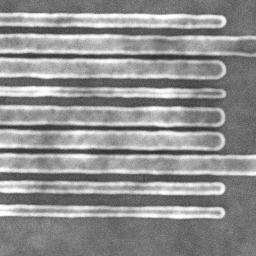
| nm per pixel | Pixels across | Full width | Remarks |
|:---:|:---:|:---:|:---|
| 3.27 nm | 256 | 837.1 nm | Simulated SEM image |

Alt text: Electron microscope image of groups of lines, slits or small figures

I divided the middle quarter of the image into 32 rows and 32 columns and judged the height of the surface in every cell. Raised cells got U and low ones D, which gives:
UUUUUUUUUUUUUUUUUUUUUUUUUUUUUUUU
UUUUUUUUUUUUUUUUUUUUUUUUUUUUUUUU
UUUUUUUUUUUUUUUUUUUUUUUUUUUUUUUU
DDDDDDDDDDDDDDDDDDDDDDDDDDDDDDDD
DDDDDDDDDDDDDDDDDDDDDDDDDDDDDDDD
DDDDDDDDDDDDDDDDDDDDDDDDDDDDDDDD
UUUUUUUUUUUUUUUUUUUUUUDDDUUUUUDD
UUUUUUUUUUUUUUUUUUUUUUUUUUUUUUUU
DDDDDDDDDDDDDDDDDDDDDDDDDDDDDDDD
DDDDDDDDDDDDDDDDDDDDDDDDDDDDDDDD
DDDDDDDDDDDDDDDDDDDDDDDDDDDDDDDD
UUUUUUUUUUUUUUUUUUUUUUUUUUUUUUUU
UUUUUUUUUUUUUUUUUUUUUUUUUUUUUUUU
UUUUUUUUUUUUUUUUUUUUUUUUUUUUUUUU
UUUUUUUUUUUUUUUUUUUUUUUUUUUUUUUU
DDDDDDDDDDDDDDDDDDDDDDDDDDDDDDDD
DDDDDDDDDDDDDDDDDDDDDDDDDDDDDDDD
UUUUUUUUUUUUUUUUUUUUUUUUUUUUUUUU
UUUUUUUUUUUUUUUUUUUUUUUUUUUUUUUU
UUUUUUUUUUUUUUUUUUUUUUUUUUUUUUUU
UUUUUUUUUUUUUUUUUUUUUUUUUUUUUUUU
DDDDDDDDDDDDDDDDDDDDDDDDDDDDDDDD
DDDDDDDDDDDDDDDDDDDDDDDDDDDDDDDD
UUUUUUUUUUUUUUUUUUUUUUUUUUUUUUUU
UUUUUUUUUUUUUUUUUUUUUUUUUUUUUUUU
UUUUUUUUUUUUUUUUUUUUUUUUUUUUUUUU
UUUUUUUUUUUUUUUUUUUUUUUUUUUUUUUU
DDDDDDDDDDDDDDDDDDDDDDDDDDDDDDDD
DDDDDDDDDDDDDDDDDDDDDDDDDDDDDDDD
DDDDDDDDDDDDDDDDDDDDDDDDDDDDDDDD
UUUUUUUUUUUUUUUUUUUUUUUUUUUUUUUU
UUUUUUUUUUUUUUUUUUUUUUUUUUUUUUUU